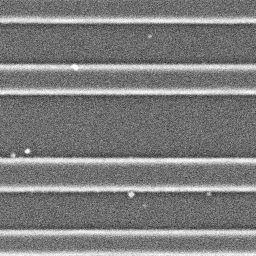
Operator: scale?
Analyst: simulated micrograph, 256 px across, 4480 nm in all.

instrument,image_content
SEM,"lines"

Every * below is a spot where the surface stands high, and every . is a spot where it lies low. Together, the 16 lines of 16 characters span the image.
****************
................
................
................
****************
****************
................
................
................
................
****************
****************
................
................
****************
****************